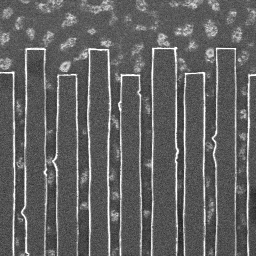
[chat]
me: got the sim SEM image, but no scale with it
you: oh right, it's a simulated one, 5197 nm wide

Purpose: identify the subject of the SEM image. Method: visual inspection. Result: parallel lines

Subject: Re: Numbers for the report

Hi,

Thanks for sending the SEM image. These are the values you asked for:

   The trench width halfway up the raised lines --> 0.234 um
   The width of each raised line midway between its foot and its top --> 416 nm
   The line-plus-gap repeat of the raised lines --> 0.644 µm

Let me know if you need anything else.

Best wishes